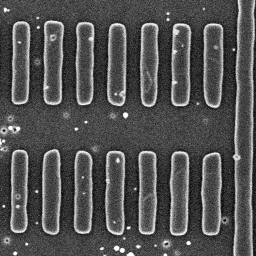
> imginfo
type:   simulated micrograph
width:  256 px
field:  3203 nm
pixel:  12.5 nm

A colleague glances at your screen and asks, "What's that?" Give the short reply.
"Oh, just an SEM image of wiring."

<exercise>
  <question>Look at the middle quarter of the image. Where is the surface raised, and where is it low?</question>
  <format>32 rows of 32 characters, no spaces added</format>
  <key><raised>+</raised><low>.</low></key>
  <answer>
...++++....++++....++++....++++.
...++++....++++....++++....++++.
...++++....++++....++++....++++.
...++++....++++....++++....++++.
...++++....++++....++++....++++.
...++++....++++....++++....++++.
...++++....++++....++++....++++.
...++++....++++.....+++....++++.
...++++....++++.....+++....++++.
....+++.....+++.....+++....++++.
................................
................................
................................
................................
................................
................................
................................
................................
................................
................................
................................
................................
...+++.....++++....++++....++++.
...++++....++++....++++....++++.
...++++....++++....++++....++++.
...++++....++++....++++....++++.
...++++....++++....++++....++++.
...++++....++++....++++....++++.
...++++....++++....++++....++++.
...++++....++++....++++....++++.
...++++....++++....++++....++++.
...++++....++++....++++....++++.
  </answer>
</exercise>